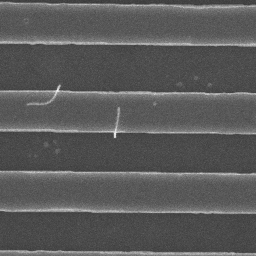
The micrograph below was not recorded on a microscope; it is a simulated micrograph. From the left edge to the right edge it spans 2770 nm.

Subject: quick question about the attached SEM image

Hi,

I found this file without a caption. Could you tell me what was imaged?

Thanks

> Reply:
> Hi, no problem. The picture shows lines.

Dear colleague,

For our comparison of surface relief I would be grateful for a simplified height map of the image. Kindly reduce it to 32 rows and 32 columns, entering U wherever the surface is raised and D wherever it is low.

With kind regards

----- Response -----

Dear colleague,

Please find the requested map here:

UUUUUDDDDDDDDDDDDDDDDDDDDDDDDDDD
UUUUUUUUUUUUUUUUUUUUUUUUUUUUUUUU
UUUUUUUUUUUUUUUUUUUUUUUUUUUUUUUU
UUUUUUUUUUUUUUUUUUUUUUUUUUUUUUUU
UUUUUUUUUUUUUUUUUUUUUUUUUUUUUUUU
DDDDDDDDDDDDDUUUUUUUUUUUUUUUUUUU
DDDDDDDDDDDDDDDDDDDDDDDDDDDDDDDD
DDDDDDDDDDDDDDDDDDDDDDDDDDDDDDDD
DDDDDDDDDDDDDDDDDDDDDDDDDDDDDDDD
DDDDDDDDDDDDDDDDDDDDDDDDDDDDDDDD
DDDDDDDDDDDDDDDDDDDDDDDDDDDDDDDD
UUUUUUUUUUUUUDDDDDDDDDDDDDDDDDDD
UUUUUUUUUUUUUUUUUUUUUUUUUUUUUUUU
UUUUUUUUUUUUUUUUUUUUUUUUUUUUUUUU
UUUUUUUUUUUUUUUUUUUUUUUUUUUUUUUU
UUUUUUUUUUUUUUUUUUUUUUUUUUUUUUUU
DDDDDDDDDDDUUUUUUUUUUUUUUUUUUUUU
DDDDDDDDDDDDDDDDDDDDDDDDDDDDDDDD
DDDDDDDDDDDDDDDDDDDDDDDDDDDDDDDD
DDDDDDDDDDDDDDDDDDDDDDDDDDDDDDDD
DDDDDDDDDDDDDDDDDDDDDDDDDDDDDDDD
UUUDDDDDDDDDDDDDDDDDDDDDDDDDDDDD
UUUUUUUUUUUUUUUUUUUUUUUUUUUUUUUU
UUUUUUUUUUUUUUUUUUUUUUUUUUUUUUUU
UUUUUUUUUUUUUUUUUUUUUUUUUUUUUUUU
UUUUUUUUUUUUUUUUUUUUUUUUUUUUUUUU
DDDDDDDDDDDDDDDDDDUUUUUUUUUUUUUU
DDDDDDDDDDDDDDDDDDDDDDDDDDDDDDDD
DDDDDDDDDDDDDDDDDDDDDDDDDDDDDDDD
DDDDDDDDDDDDDDDDDDDDDDDDDDDDDDDD
DDDDDDDDDDDDDDDDDDDDDDDDDDDDDDDD
UUUUUUUUUUUUDDDDDDDDDDDDDDDDDDDD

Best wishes